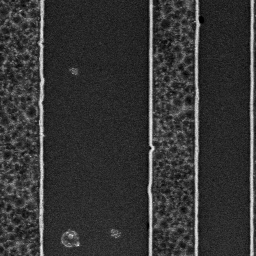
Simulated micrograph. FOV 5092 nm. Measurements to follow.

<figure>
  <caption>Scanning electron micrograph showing one or a few lines or trenches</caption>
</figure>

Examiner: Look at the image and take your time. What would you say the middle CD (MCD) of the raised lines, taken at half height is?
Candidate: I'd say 915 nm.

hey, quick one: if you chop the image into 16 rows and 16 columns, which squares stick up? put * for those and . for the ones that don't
***......***....
***......***....
***......***....
***......***....
***......***....
***......***....
***......***....
***......***....
***......***....
***......***....
***......***....
***......***....
***......***....
***......***....
***......***....
***......***....